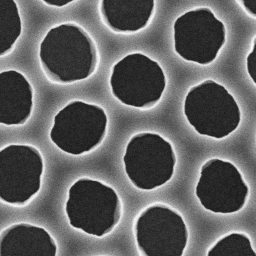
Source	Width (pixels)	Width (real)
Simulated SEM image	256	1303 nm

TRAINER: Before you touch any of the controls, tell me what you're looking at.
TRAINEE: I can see a regular array of holes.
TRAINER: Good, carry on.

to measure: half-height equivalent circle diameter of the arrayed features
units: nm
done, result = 271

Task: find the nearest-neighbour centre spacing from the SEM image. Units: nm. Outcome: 380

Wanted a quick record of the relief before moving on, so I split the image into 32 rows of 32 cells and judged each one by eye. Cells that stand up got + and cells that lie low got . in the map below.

..++++..+++++......++++++++++++.
..+++++++++++......++++...+++++.
...++++++++++.....++++.....+++++
...++++...++++....++++......++++
..++++.....+++++++++++......++++
..+++......+++++++++++......++++
.++++.......++++++++++.....++++.
+++++.......+++....++++....++++.
++++++......++......+++++++++++.
...++++....+++......+++++++++++.
....++++++++++.......++++..+++++
....++++++++++......++++....++++
....+++++++++++.....+++......+++
....++++.....++++++++++.......++
....+++......++++++++++.......++
+.+++++......+++++++++++......++
++++++.......++++++++++++....+++
+++++++......+++.....+++++++++++
+...+++....+++++.....+++++++++++
.....+++++++++++......++++++++++
.....+++++++++++......++++...+++
.....+++++++++++......+++.....++
.....+++++.+++++.....++++.....++
.....++++.....+++..++++++......+
....+++++......++++++++++......+
++++++++.......++++++++++.....++
++++++++.......+++....+++++..+++
+++++++++......++......+++++++++
+....+++++....+++......+++++++++
......+++++++++++......+++++...+
.......++++++++++......++++....+
.......+++++++++++.....+++......